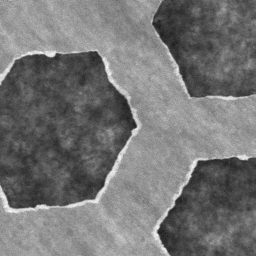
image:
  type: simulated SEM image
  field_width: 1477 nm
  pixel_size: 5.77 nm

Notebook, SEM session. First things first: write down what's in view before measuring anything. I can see holes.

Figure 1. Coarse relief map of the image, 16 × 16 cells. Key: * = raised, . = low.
**********......
**********......
**********......
**....*****.....
.......****.....
.......*****....
........********
........********
........********
........********
.......*****....
.......*****....
......*****.....
**********......
**********......
**********......